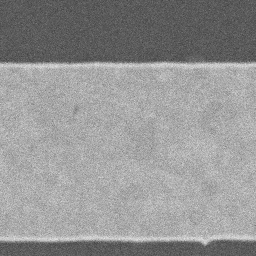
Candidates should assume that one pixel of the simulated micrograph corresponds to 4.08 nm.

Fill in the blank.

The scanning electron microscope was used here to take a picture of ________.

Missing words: one or a few lines or trenches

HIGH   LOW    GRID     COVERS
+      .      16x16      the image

................
................
................
................
++++++++++++++++
++++++++++++++++
++++++++++++++++
++++++++++++++++
++++++++++++++++
++++++++++++++++
++++++++++++++++
++++++++++++++++
++++++++++++++++
++++++++++++++++
++++++++++++++++
................